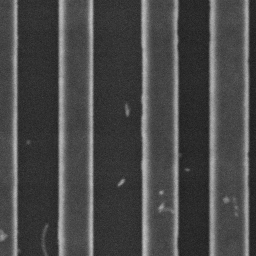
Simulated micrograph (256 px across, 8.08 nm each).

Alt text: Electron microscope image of lines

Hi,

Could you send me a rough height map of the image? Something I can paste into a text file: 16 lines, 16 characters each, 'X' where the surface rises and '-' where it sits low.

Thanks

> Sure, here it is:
X---XX---XX--XXX
X---XX---XX--XXX
X---XX---XX--XXX
X---XX---XX--XXX
X---XX---XX--XXX
X---XX---XX--XXX
X---XX---XX--XXX
X---XX---XX--XXX
X---XX---XX--XXX
X---XX---XX--XXX
X---XX---XX--XXX
X---XX---XX--XX-
X---XX---XX--XX-
X---XX---XX--XXX
X---XX---XX--XXX
X---XX---XX--XXX